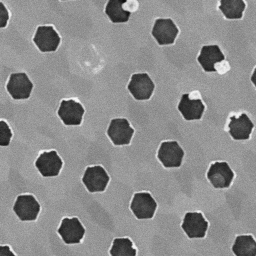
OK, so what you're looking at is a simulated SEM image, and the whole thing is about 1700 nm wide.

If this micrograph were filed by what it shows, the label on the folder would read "a regular array of holes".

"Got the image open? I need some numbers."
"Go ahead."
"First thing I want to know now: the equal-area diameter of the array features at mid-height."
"0.174 microns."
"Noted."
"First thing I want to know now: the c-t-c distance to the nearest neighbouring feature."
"0.344 µm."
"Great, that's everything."